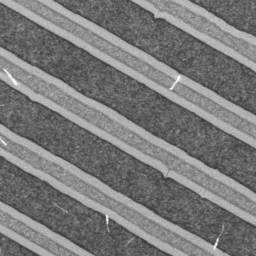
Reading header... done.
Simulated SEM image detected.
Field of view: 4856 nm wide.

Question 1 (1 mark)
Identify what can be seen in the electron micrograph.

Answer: one or a few lines or trenches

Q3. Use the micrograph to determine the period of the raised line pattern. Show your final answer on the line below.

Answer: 1270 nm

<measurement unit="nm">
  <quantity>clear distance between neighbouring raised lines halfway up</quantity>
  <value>887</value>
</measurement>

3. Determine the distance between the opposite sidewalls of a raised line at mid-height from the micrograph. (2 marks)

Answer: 387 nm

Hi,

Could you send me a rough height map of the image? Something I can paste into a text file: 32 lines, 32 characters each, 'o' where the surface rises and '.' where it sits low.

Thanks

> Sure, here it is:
.ooooo............ooooo.........
...ooooo...........oooooo.......
.....ooooo............ooooo.....
.......ooooo...........ooooo....
.........oooo............ooooo..
..........ooooo............ooooo
............ooooo............ooo
oo............ooooo...........oo
oooo...........ooooo............
ooooo............ooooo..........
..ooooo............ooooo........
....ooooo............ooooo......
.....oooooo...........ooooo.....
.......oooooo...........ooooo...
.........ooooo............ooooo.
...........ooooo............oooo
o...........oooooo...........ooo
oo............ooooo............o
oooo............ooooo...........
.ooooo............ooooo.........
...ooooo............ooooo.......
.....ooooo...........ooooo......
......ooooo............ooooo....
........ooooo............ooooo..
..........oooo............oooooo
............oooo............oooo
o.............oooo............oo
ooo............ooooo............
ooooo............ooooo..........
..ooooo...........oooooo........
....oooo............ooooo.......
.....ooooo............ooooo.....